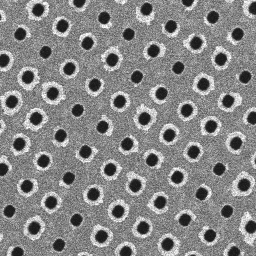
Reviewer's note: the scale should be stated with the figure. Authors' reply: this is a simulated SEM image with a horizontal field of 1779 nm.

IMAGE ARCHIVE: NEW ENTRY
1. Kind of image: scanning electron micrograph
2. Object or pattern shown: a regular array of holes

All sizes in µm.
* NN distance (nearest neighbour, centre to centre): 0.206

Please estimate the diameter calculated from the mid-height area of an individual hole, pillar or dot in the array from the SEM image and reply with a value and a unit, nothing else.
81.1 nanometers